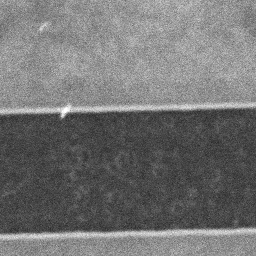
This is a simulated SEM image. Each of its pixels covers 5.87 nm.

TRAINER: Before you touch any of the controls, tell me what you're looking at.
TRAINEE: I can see one or a few lines or trenches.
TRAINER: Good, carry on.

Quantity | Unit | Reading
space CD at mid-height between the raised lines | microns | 0.732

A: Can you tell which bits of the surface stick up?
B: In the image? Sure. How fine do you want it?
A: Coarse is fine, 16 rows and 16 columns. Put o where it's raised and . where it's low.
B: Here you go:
oooooooooooooooo
oooooooooooooooo
oooooooooooooooo
oooooooooooooooo
oooooooooooooooo
oooooooooooooooo
oooooooooooooooo
................
................
................
................
................
................
................
...........oo.oo
oooooooooooooooo